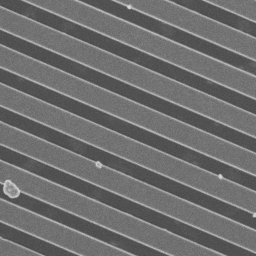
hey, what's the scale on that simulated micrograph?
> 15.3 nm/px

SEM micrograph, parallel lines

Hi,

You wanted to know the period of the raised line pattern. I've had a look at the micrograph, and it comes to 35.4 pixels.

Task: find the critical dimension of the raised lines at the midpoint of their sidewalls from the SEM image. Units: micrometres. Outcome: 0.329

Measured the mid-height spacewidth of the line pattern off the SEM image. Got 0.218 microns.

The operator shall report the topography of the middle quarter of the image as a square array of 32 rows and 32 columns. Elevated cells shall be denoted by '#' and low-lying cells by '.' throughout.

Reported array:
......#############.........####
........##############.........#
#.........##############........
####.........#############......
######.........##############...
########.........##############.
###########.........############
#############.........##########
..#############.........########
.....#############.........#####
.......#############.........###
.........#############.........#
##..........#############.......
#####.........#############.....
#######.........##############..
#########..........#############
############.........###########
##############.........#########
...#############..........######
.....##############.........####
........#############.........##
#.........#############.........
###.........##############......
######.........#############....
#########........#############..
##########.........#############
#############.........##########
.##############.........########
....#############.........######
......##############.........###
........##############.........#
##.........#############........